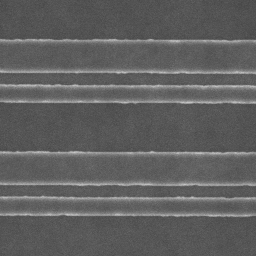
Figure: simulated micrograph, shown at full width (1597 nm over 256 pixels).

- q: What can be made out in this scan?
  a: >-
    lines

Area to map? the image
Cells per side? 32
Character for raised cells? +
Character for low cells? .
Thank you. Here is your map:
................................
................................
................................
................................
................................
++++++++++++++++++++++++++++++++
++++++++++++++++++++++++++++++++
++++++++++++++++++++++++++++++++
++++++++++++++++++++++++++++++++
++++++++++++++++++++++++++++++++
++++++++++++++++++++++++++++++++
++++++++++++++++++++++++++++++++
++++++++++++++++++++++++++++++++
................................
................................
................................
................................
................................
................................
++++++++++++++++++++++++++++++++
++++++++++++++++++++++++++++++++
++++++++++++++++++++++++++++++++
++++++++++++++++++++++++++++++++
++++++++++++++++++++++++++++++++
++++++++++++++++++++++++++++++++
++++++++++++++++++++++++++++++++
++++++++++++++++++++++++++++++++
................................
................................
................................
................................
................................